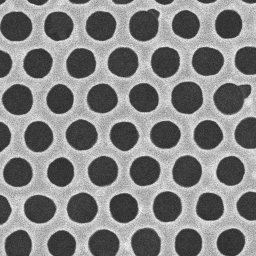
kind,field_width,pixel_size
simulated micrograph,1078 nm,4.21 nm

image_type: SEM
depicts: a regular array of holes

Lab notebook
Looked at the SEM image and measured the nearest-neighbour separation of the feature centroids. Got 41.5 px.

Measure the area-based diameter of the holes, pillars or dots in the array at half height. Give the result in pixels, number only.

29.7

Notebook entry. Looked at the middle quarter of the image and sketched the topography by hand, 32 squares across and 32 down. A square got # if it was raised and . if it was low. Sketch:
#.......###........###.......###
#.......###.......####......####
#......#####.....######.....####
###..####################.######
##############################..
#######.....######....######....
..####......#####......####.....
..####.......###.......####.....
..####.......###........###.....
..####.......###........###.....
..####.......####......####.....
.######.....######....######....
##############################..
################################
##....########..########...#####
#.......####......#####.....####
#.......####......####.......###
........###........##........###
........####.......###.......###
#.......####......####......####
##.....######.....#####.....####
####..########..################
################################
########....######....#######...
..#####......####.......####....
..####.......####.......###.....
...###........##........###.....
...###.......###........###.....
..####.......####.......###.....
.######.....######.....#####....
.#######.##########.##########..
################################